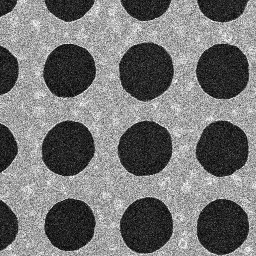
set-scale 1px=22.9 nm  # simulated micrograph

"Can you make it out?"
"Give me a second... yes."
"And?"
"a regular array of holes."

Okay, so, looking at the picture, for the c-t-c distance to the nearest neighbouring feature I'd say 1760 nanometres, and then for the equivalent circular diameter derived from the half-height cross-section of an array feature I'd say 1250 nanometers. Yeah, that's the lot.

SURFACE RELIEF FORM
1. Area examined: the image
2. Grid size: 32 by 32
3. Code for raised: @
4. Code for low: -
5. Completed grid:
--@@@@------@@@------@@@@------@
-@@@@@-----@@@@@-----@@@@-----@@
@@@@@@@@--@@@@@@@--@@@@@@@---@@@
@@@@@@@@@@@@@@@@@@@@@@@@@@@@@@@@
@@@@@@@@@@@@@@@@@@@@@@@@@@@@@@@@
@@@@@@@@-@@@@@@@@---@@@@@@@--@@@
-@@@@@-----@@@@@-----@@@@-----@@
--@@@@------@@@------@@@@------@
--@@@-------@@@-------@@@------@
--@@@-------@@@-------@@@------@
--@@@@-----@@@@------@@@@------@
-@@@@@----@@@@@@-----@@@@@----@@
@@@@@@@@@@@@@@@@@--@@@@@@@@@@@@@
@@@@@@@@@@@@@@@@@@@@@@@@@@@@@@@@
@@@@@@@@@@@@@@@@@@@@@@@@@@@@@@@@
@@@@@@@---@@@@@@@---@@@@@@---@@@
-@@@@@-----@@@@@-----@@@@-----@@
--@@@-------@@@------@@@@------@
--@@@-------@@@-------@@-------@
--@@@-------@@@------@@@@------@
-@@@@@-----@@@@------@@@@------@
@@@@@@@---@@@@@@----@@@@@@---@@@
@@@@@@@@@@@@@@@@@@@@@@@@@@@@@@@@
@@@@@@@@@@@@@@@@@@@@@@@@@@@@@@@@
@@@@@@@@@@@@@@@@@@@@@@@@@@@@@@@@
-@@@@@@----@@@@@-----@@@@@----@@
--@@@@------@@@@-----@@@@------@
--@@@@------@@@-------@@@------@
--@@@-------@@@-------@@@------@
--@@@@------@@@------@@@@------@
-@@@@@@----@@@@@-----@@@@-----@@
@@@@@@@@@@@@@@@@@--@@@@@@@---@@@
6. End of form